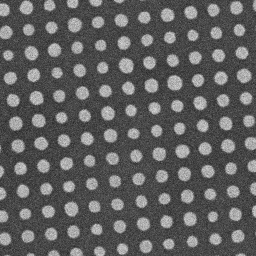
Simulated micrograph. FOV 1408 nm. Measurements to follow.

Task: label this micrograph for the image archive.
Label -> a regular array of raised bodies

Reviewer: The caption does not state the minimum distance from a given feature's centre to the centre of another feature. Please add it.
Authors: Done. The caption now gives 0.125 micrometres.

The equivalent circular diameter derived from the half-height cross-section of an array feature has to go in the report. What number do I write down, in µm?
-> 0.0683